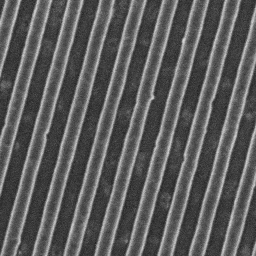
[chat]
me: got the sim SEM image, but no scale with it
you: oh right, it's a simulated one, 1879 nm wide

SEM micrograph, parallel lines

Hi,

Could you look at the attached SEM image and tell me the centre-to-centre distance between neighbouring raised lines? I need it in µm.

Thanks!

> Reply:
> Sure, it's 0.223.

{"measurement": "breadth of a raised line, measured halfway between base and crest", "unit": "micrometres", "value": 0.1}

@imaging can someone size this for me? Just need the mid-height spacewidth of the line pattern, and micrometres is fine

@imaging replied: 0.125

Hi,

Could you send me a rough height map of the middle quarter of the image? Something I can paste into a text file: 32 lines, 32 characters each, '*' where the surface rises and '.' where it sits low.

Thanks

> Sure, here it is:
.....***.....***....****....****
....****....****....****....****
....****....****....***.....***.
....***.....***.....***.....***.
....***.....***....****....****.
...****....****....****....****.
...****....****....***.....***..
...****....***.....***....****..
...***.....***....****....****..
..****....****....***.....***...
..****....***.....***.....***...
..***.....***.....***....****...
.****.....***....****....****...
.****....****....***.....***....
.****....***.....***.....***....
.***.....***....****....****....
.***....****....****....****....
****....****....***.....***.....
***.....***.....***....****....*
***.....***....****....****....*
***....****....****....****....*
***....****....***.....***.....*
**.....***.....***....****....**
**.....***....****....****....**
**....****....****....***.....**
**....****....***.....***....***
*.....***.....***....****....***
*.....***....****....****....***
*....****....***.....***.....***
.....***.....***....****....****
.....***....****....****....****
....****....****....****....***.